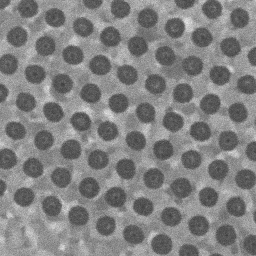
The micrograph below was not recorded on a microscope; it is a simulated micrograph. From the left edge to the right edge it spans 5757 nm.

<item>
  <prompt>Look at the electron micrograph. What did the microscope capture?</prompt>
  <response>a regular array of ring-shaped grooves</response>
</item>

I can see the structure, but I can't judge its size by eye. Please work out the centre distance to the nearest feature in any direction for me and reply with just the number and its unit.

651 nanometers